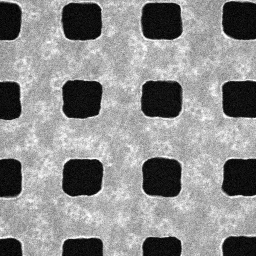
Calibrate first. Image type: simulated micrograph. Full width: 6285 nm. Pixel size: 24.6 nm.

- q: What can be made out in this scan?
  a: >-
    holes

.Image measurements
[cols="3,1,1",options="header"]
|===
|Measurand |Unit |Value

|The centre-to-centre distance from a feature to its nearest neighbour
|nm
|1910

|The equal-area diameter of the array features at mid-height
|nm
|1040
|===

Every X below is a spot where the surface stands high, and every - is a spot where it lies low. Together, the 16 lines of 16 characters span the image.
-XXX--XXX--XXX--
-XXX--XXX--XXX--
-XXXX-XXXXXXXXXX
XXXXXXXXXXXXXXXX
XXXXXXXXXXXXXXXX
-XXX--XXX--XXX--
-XXX--XXX--XXX--
XXXXXXXXXXXXXXXX
XXXXXXXXXXXXXXXX
XXXXXXXXXXXXXXXX
-XXX--XXX--XXX--
-XXX--XXX--XXX--
XXXXXXXXXXXXXXXX
XXXXXXXXXXXXXXXX
XXXXXXXXXXXXXXXX
-XXX--XXX--XXX--